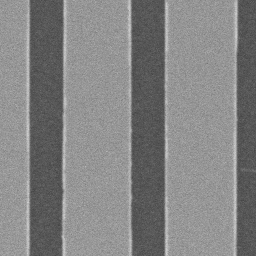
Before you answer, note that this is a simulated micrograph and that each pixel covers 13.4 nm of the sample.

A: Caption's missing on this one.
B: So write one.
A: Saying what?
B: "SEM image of lines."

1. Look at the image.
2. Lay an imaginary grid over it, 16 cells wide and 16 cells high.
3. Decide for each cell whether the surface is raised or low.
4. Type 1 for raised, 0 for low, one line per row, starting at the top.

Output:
1100111100111110
1100111100111110
1100111100111110
1100111100111110
1100111100111110
1100111100111110
1100111100111110
1100111100111110
1100111100111110
1100111100111110
1100111100111110
1100111100111110
1100111100111110
1100111100111110
1100111100111110
1100111100111110